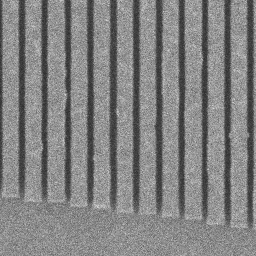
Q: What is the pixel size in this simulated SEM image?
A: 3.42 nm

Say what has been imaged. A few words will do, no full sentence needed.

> parallel lines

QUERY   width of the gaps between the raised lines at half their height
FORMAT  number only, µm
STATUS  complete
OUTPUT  0.0192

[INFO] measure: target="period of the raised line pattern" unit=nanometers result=78.1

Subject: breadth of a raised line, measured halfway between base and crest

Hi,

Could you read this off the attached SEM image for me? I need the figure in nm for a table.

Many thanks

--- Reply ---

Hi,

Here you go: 58.2